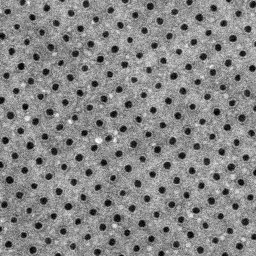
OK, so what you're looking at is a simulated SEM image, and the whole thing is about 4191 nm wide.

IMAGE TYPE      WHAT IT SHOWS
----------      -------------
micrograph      a regular array of raised bodies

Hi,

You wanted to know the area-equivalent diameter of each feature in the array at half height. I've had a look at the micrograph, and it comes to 8.52 px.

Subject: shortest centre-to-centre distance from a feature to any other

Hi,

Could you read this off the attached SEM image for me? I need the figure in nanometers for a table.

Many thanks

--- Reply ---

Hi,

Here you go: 285